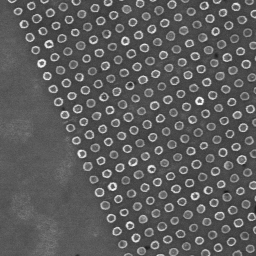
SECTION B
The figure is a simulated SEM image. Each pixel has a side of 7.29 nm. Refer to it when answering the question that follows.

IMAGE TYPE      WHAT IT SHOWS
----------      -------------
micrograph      a regular array of raised bodies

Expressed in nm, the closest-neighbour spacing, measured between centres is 102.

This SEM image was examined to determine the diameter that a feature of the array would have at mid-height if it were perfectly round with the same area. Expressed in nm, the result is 61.